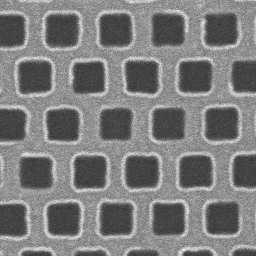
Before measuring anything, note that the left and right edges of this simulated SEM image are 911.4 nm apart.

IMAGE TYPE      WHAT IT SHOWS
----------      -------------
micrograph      a regular array of holes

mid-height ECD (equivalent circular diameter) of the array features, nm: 125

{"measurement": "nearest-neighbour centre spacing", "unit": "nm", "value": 189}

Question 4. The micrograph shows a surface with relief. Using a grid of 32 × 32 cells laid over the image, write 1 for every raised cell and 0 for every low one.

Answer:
11111111111111111111111111111111
11111111111111111111111111111111
00011100001110001110000111000011
00011100001100001110000111000011
00011100001100001110000111000011
00011100011110001110000111000111
11111111111111111111111111111111
11111111111111111111111111111110
11000011100001110000110000111000
11000011100001110000110000111000
11000011100001110000110000111000
11100111110011111001111000111101
11111111111111111111111111111111
11111111111111001111001111111111
00011100001110000110000111000011
00011100001100001110000111000011
00011100001100001110000111000011
00111100011111101111111111001111
11111111111111111111111111111111
11111111111111110001111100111100
11000011100001110000110000111000
11000011100001110000110000111000
11000011100001110000110000111000
11100011110111111111111011111111
11111111111111111111111111111111
00111110011110111110000111000111
00011100001110000110000111000011
00011100001110000110000111000011
00011100001110001110000111000011
11011111111111111111111111111111
11111111111111111111111111111111
11100011110001110001111000111000